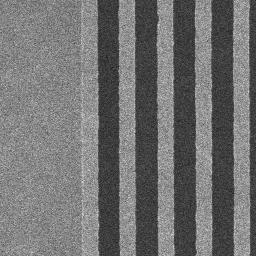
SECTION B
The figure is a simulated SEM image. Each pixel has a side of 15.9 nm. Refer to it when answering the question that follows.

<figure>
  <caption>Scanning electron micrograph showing parallel lines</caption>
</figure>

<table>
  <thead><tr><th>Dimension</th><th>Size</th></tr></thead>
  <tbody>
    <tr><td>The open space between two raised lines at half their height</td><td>345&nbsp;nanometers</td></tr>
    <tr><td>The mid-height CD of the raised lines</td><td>0.251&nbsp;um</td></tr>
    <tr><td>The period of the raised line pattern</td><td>603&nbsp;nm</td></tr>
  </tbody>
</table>